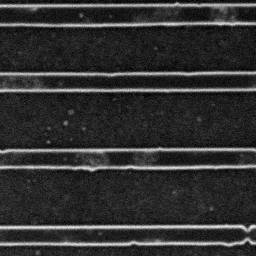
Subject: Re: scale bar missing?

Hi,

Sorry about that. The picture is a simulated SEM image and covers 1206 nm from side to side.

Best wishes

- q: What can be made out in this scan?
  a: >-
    one or a few lines or trenches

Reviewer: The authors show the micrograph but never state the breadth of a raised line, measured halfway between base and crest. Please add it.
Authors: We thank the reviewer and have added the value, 84.1 nanometers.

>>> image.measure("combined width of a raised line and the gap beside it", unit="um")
0.346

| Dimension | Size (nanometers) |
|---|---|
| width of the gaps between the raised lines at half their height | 276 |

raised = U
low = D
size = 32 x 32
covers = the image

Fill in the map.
DDDDDDDDDDDDDDDDDDDDDDDDDDDDDDDD
UUUUUUUUUUUUUUUUUUUUUUUUUUUUUUUU
UUUUUUUUUUUUUUUUUUUUUUUUUUUUUUUU
DDDDDDDDDDDDDDDDDDDDDDDDDDDDDDDD
DDDDDDDDDDDDDDDDDDDDDDDDDDDDDDDD
DDDDDDDDDDDDDDDDDDDDDDDDDDDDDDDD
DDDDDDDDDDDDDDDDDDDDDDDDDDDDDDDD
DDDDDDDDDDDDDDDDDDDDDDDDDDDDDDDD
DDDDDDDDDDDDDDDDDDDDDDDDDDDDDDDD
UUUUUUUUUUUUUUUUUUUUUUUUUUUUUUUU
UUUUUUUUUUUUUUUUUUUUUUUUUUUUUUUU
DDDDDDDDDDDDDDDDDDDDDDDDDDDDDDDD
DDDDDDDDDDDDDDDDDDDDDDDDDDDDDDDD
DDDDDDDDDDDDDDDDDDDDDDDDDDDDDDDD
DDDDDDDDDDDDDDDDDDDDDDDDDDDDDDDD
DDDDDDDDDDDDDDDDDDDDDDDDDDDDDDDD
DDDDDDDDDDDDDDDDDDDDDDDDDDDDDDDD
DDDDDDDDDDDDDDDDDDDDDDDDDDDDDDDD
DDDDDDDDDDDDDDDDDDDDDDDDDDDDDDDD
UUUUUUUUUUUUUUUUUUUUUUUUUUUUUUUU
UUUUUUUUUUUUUUUUUUUUUUUUUUUUUUUU
DDDDDDDDDDDDDDDDDDDDDDDDDDDDDDDD
DDDDDDDDDDDDDDDDDDDDDDDDDDDDDDDD
DDDDDDDDDDDDDDDDDDDDDDDDDDDDDDDD
DDDDDDDDDDDDDDDDDDDDDDDDDDDDDDDD
DDDDDDDDDDDDDDDDDDDDDDDDDDDDDDDD
DDDDDDDDDDDDDDDDDDDDDDDDDDDDDDDD
DDDDDDDDDDDDDDDDDDDDDDDDDDDDDDDD
UUUUUUUUUUUUUUUUUUUUUUUUUUUUUUUU
UUUUUUUUUUUUUUUUUUUUUUUUUUUUUUUU
UUUDDUUUUUUUUUUDDDDDDDDDDDDDUDDD
DDDDDDDDDDDDDDDDDDDDDDDDDDDDDDDD